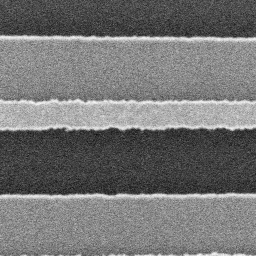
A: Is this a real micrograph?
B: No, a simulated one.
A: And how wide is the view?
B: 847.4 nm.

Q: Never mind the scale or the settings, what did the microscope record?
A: lines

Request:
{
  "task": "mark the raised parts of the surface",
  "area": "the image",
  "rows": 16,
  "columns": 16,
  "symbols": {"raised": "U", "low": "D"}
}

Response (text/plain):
DDDDDDDDDDDDDDDD
DDDDDDDDDDDDDDDD
UUUUUUUUUUUUUUUU
UUUUUUUUUUUUUUUU
UUUUUUUUUUUUUUUU
UUUUUUUUUUUUUUUU
UUUUUUUUUUUUUUUU
UUUUUUUUUUUUUUUU
DDDDDDDDDDDDDDDD
DDDDDDDDDDDDDDDD
DDDDDDDDDDDDDDDD
DDDDDDDDDDDDDDDD
UUUUUUUUUUUUUUUU
UUUUUUUUUUUUUUUU
UUUUUUUUUUUUUUUU
UUUUUUUUUUUUUUUU